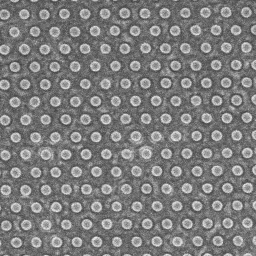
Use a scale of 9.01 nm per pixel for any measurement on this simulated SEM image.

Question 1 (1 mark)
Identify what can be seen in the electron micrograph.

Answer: a regular array of raised bodies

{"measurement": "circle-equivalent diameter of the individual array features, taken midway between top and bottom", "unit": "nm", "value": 89.2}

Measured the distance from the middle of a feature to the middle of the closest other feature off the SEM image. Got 0.179 micrometres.